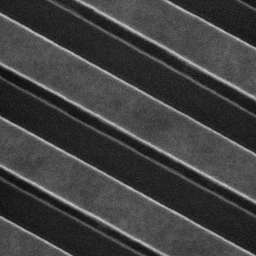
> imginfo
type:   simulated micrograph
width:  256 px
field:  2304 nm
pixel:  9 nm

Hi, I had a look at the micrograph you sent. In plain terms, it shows lines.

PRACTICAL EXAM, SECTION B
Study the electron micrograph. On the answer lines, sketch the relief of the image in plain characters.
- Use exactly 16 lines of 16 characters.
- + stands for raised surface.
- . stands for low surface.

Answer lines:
......+++++.....
+.......+++++...
+++......++++++.
+++++......+++++
.++++++......+++
...++++++......+
.....+++++......
......++++++....
++......++++++..
++++......++++++
++++++......++++
..++++++......++
....++++++......
......+++++.....
++......+++++...
++++.....++++++.